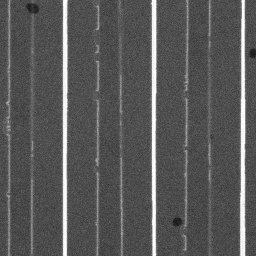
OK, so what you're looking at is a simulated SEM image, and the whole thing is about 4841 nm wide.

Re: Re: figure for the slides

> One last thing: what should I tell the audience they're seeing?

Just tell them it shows lines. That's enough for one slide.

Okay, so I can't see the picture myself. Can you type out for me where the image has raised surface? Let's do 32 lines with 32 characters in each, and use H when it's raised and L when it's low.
LHHHLLLLLLLLHHHLLLLLLLLHHHLLLLLL
LHHHLLLLLLLLHHHLLLLLLLLLHHLLLLLL
LHHHLLLLLLLLHHHLLLLLLLLLHHLLLLLL
LHHHLLLLLLLLHHHLLLLLLLLLHHLLLLLL
LHHHLLLLLLLLHHHLLLLLLLLHHHLLLLLL
LHHHLLLLLLLLHHHLLLLLLLLHHHLLLLLL
LHHHLLLLLLLLHHHLLLLLLLLHHHLLLLLL
LHHHLLLLLLLLHHHLLLLLLLLHHHLLLLLL
LHHHLLLLLLLLHHHLLLLLLLLHHHLLLLLL
LHHHLLLLLLLLHHHLLLLLLLLHHHLLLLLL
LHHHLLLLLLLLHHHLLLLLLLLHHHLLLLLL
LHHHLLLLLLLLHHHLLLLLLLLHHHLLLLLL
LHHHLLLLLLLLHHHLLLLLLLLHHHLLLLLL
LHHHLLLLLLLLHHHLLLLLLLLHHHLLLLLL
LHHHLLLLLLLLHHHLLLLLLLLHHHLLLLLL
LHHHLLLLLLLLHHHLLLLLLLLHHHLLLLLL
LHHHLLLLLLLLHHHLLLLLLLLHHHLLLLLL
LHHHLLLLLLLLHHHLLLLLLLLHHHLLLLLL
LHHHLLLLLLLLHHHLLLLLLLLHHHLLLLLL
LHHHLLLLLLLLHHHLLLLLLLLHHHLLLLLL
LHHHLLLLLLLLHHHLLLLLLLLHHHLLLLLL
LHHHLLLLLLLLHHHLLLLLLLLHHHLLLLLL
LHHHLLLLLLLLHHHLLLLLLLLHHHLLLLLL
LHHHLLLLLLLLHHHLLLLLLLLHHHLLLLLL
LHHHLLLLLLLLHHHLLLLLLLLHHHLLLLLL
LHHHLLLLLLLLHHHLLLLLLLLHHHLLLLLL
LHHHLLLLLLLLHHHLLLLLLLLHHHLLLLLL
LHHHLLLLLLLLHHHLLLLLLLLHHHLLLLLL
LHHHLLLLLLLLHHHLLLLLLLLHHHLLLLLL
LHHHLLLLLLLLHHHLLLLLLLLHHHLLLLLL
LHHHLLLLLLLLHHHLLLLLLLLHHHLLLLLL
LHHHLLLLLLLLHHHLLLLLLLLHHHLLLLLL